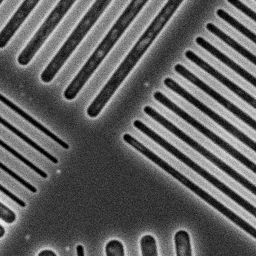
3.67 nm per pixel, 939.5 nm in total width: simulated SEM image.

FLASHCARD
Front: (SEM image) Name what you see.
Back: groups of lines, slits or small figures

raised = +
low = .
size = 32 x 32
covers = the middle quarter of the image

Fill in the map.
+++++....+++++....++++++++++..++
++++....+++++....+++++++++++...+
+++....+++++....+++++++++++++...
++....+++++.....+++++++++..+++..
++....+++++....++++++++++...+++.
+....+++++....+++++++++++....+++
....+++++....++++++++++++++...++
...+++++....++++++++++...+++....
...+++++....++++++++++....++++..
+++++++....+++++++++++++...++++.
++++++....+++++++++++++++...++++
++++++....++++++++++...+++....++
++++++...++++++++++++...++++...+
++++++++++++++++++++++....+++...
+++++++++++++++++...+++....++++.
+++++++++++++++++....+++....++++
+++++++++++++++++++...++++...+++
++++++++++++++++++++...++++....+
+++++++++++++++...+++....+++....
++++++++++++++++...++++...++++..
.++++++++++++++++...++++....+++.
++++++++++++++++++....+++....+++
+++++++++++++++++++....++++...++
+++++++++++++++++++++...++++...+
++++++++++++++++++++++....++++..
++++++++++++++++++++++++...++++.
+++++++++++++++++++++++++...++++
++++++++++++++++++++++++++...+++
++++++++++++++++++++++++++++...+
+++++++++++++++++++++++++++++...
++++++++++++++++++++++++++++++..
++++++++++++++++++++++++++++++++